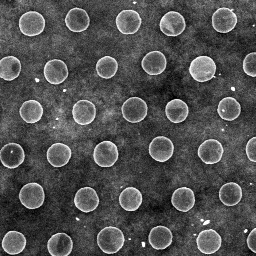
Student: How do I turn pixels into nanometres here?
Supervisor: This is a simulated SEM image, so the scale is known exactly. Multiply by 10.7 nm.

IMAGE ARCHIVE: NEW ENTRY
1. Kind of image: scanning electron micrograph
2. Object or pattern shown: a regular array of raised bodies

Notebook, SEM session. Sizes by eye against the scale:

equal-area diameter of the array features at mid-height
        259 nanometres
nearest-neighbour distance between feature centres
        497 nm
